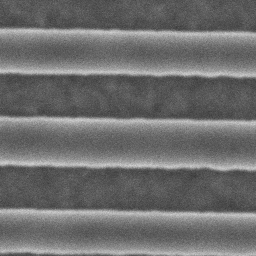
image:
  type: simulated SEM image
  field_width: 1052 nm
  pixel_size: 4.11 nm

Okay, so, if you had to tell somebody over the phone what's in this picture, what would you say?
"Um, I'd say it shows lines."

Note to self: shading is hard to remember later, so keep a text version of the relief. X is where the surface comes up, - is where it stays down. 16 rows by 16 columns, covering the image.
----------------
----------------
XXXXXXXXXXXXXXXX
XXXXXXXXXXXXXXXX
XXXXXXXXXXXXXXXX
----------------
----------------
XXXXXXX-X-------
XXXXXXXXXXXXXXXX
XXXXXXXXXXXXXXXX
-------------XXX
----------------
----------------
XXXXXXXXXXXXXXXX
XXXXXXXXXXXXXXXX
XXXXXXXXXXXXXXXX